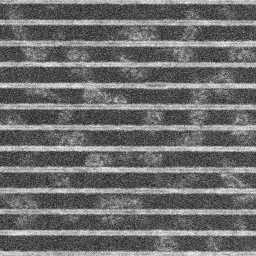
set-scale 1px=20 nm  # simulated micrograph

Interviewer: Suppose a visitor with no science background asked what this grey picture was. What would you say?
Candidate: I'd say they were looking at parallel lines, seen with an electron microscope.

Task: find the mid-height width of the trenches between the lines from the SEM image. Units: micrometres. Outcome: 0.368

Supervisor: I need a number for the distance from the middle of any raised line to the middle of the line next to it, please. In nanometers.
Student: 421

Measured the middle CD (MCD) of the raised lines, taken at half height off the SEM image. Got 57.5 nm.